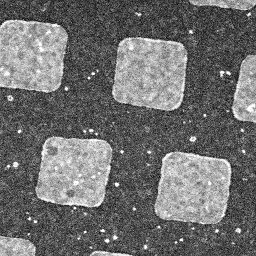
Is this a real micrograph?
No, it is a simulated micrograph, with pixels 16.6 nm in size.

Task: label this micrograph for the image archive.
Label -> raised bodies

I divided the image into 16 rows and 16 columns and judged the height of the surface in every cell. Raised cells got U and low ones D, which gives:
DDDDDDDDDDDDDDUU
UUUDDDDDDDDDDDDD
UUUUDDDDUUDDDDDD
UUUUDDDUUUUUDDDD
UUUUDDDUUUUUDDDU
DUUDDDDUUUUDDDDU
DDDDDDDDUUUDDDDU
DDDDDDDDDDDDDDDU
DDDDDDDDDDDDDDDD
DDDUUUUDDDDDDDDD
DDDUUUUDDDUUUUDD
DDUUUUUDDDUUUUDD
DDDUUUDDDDUUUUDD
DDDDDDDDDDUUUUDD
DDDDDDDDDDDDDDDD
UUDDDDDDDDDDDDDD